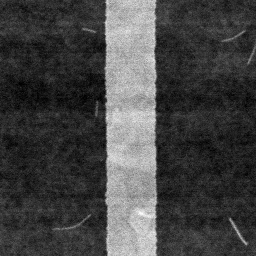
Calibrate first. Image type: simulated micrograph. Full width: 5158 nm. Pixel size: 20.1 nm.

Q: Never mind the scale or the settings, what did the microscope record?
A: one or a few lines or trenches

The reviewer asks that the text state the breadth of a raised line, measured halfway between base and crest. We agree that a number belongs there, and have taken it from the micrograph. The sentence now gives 965 nanometers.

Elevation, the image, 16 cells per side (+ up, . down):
.......+++......
.......+++......
.......+++......
.......+++......
.......+++......
.......+++......
.......+++......
.......+++......
.......+++......
.......+++......
.......+++......
.......+++......
.......+++......
.......+++......
.......+++......
.......+++......